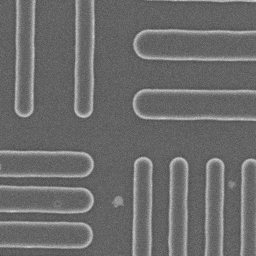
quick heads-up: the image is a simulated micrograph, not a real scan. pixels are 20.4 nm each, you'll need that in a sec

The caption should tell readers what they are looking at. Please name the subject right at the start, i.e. groups of lines, slits or small figures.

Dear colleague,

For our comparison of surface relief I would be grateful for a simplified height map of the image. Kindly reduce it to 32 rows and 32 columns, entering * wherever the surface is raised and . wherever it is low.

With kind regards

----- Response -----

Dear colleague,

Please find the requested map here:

..**......**....................
..**......**....................
..**......**....................
..**......**....................
..**......**.....***************
..**......**.....***************
..**......**.....***************
..**......**.............*******
..**.....***....................
..**.....***....................
..**.....***....................
..**.....***.....***************
..**.....***.....***************
..**.....**......***************
..........*......***************
................................
................................
................................
................................
***********.....................
************.....**..**...**..**
***********......**..**...**..**
.................**..**...**..**
*********........**..**...**..**
***********......**..**...**..**
************.....**..**...**..**
.....******......**..**...**..**
.................**..**...**..**
***********......**..**...**..**
***********......**..**...**..**
***********......**..**...**..**
.................**..**...**..**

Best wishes